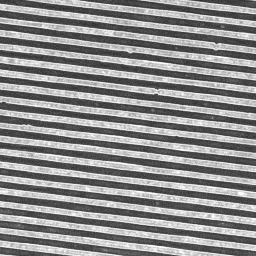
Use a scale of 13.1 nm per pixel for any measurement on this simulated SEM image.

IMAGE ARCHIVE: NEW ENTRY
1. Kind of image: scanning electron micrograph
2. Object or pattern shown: parallel lines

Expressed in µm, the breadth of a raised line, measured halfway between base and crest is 0.0762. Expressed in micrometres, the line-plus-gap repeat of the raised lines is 0.171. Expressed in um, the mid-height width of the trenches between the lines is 0.0957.